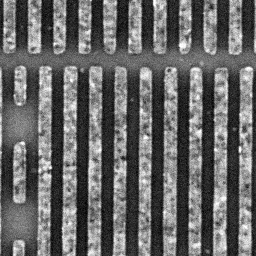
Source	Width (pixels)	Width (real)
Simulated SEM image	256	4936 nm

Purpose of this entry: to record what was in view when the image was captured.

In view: wiring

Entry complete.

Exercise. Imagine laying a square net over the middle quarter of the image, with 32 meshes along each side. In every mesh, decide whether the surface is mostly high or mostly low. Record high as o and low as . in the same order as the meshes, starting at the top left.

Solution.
................................
ooo....oo....oo....ooo....oo....
ooo....oo....ooo...ooo...ooo....
ooo....oo....ooo...ooo...ooo....
ooo....oo....ooo...ooo...ooo....
ooo....oo....ooo...ooo...ooo....
ooo....oo....ooo...ooo...ooo....
ooo....oo....ooo...ooo...ooo....
ooo....oo....ooo...ooo...ooo....
ooo....oo....ooo...ooo...ooo...o
ooo....oo....ooo...ooo...ooo...o
ooo....oo....oo....ooo...ooo...o
ooo....oo....oo....ooo...ooo...o
ooo....oo....oo....ooo...ooo...o
ooo....oo....oo....ooo...ooo...o
ooo....oo....oo....ooo...ooo...o
ooo....oo....oo....ooo...ooo...o
ooo....oo....oo....ooo...ooo...o
ooo...ooo....oo....ooo...ooo...o
ooo...ooo....oo....ooo...ooo...o
ooo...ooo....oo....ooo...ooo...o
ooo...ooo....oo....ooo...ooo...o
ooo...ooo....oo....ooo...ooo...o
ooo...ooo....oo....ooo...ooo...o
ooo...ooo....oo....ooo...ooo...o
ooo...ooo....oo....ooo...ooo...o
ooo...ooo....oo....ooo...ooo...o
ooo...ooo....oo....ooo...ooo...o
ooo...ooo....oo....ooo...ooo...o
ooo...ooo....oo....ooo...ooo...o
ooo...ooo....oo....ooo...ooo...o
ooo...ooo....oo....oo....ooo...o